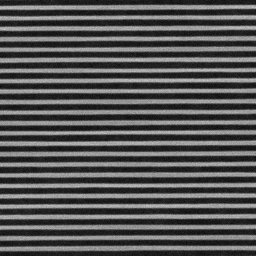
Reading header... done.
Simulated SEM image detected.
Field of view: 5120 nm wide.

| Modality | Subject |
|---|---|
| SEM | parallel lines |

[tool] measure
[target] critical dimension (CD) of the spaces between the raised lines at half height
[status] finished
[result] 135 nanometers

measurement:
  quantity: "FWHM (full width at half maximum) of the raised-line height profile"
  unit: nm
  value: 77.5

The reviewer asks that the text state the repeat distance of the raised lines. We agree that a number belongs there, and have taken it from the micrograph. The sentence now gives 0.21 microns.